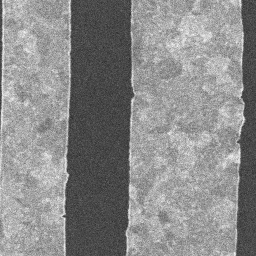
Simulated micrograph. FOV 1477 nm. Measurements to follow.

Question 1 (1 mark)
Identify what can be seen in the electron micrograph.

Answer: one or a few lines or trenches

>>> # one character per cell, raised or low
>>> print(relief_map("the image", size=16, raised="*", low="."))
****....*******.
****....*******.
****....*******.
****....*******.
****....*******.
****....*******.
****....*******.
****....*******.
****....*******.
****....*******.
****....*******.
****....*******.
****....*******.
****....*******.
****....*******.
****....*******.